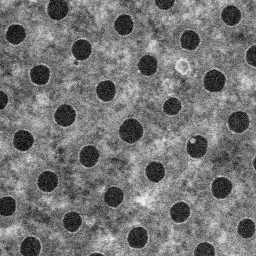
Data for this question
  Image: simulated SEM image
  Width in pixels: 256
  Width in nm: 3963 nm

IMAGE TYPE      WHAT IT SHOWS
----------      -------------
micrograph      a regular array of raised bodies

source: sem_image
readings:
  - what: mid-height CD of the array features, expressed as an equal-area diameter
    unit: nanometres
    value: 347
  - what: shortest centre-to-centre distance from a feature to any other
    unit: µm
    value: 0.732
